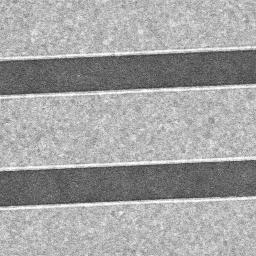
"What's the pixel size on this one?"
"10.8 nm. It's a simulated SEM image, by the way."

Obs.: one or a few lines or trenches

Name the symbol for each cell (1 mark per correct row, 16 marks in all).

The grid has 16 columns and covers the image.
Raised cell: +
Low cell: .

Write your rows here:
++++++++++++++++
++++++++++++++++
++++++++++++++++
++++............
................
.............+++
++++++++++++++++
++++++++++++++++
++++++++++++++++
++++++++++++++++
+...............
................
..............++
++++++++++++++++
++++++++++++++++
++++++++++++++++